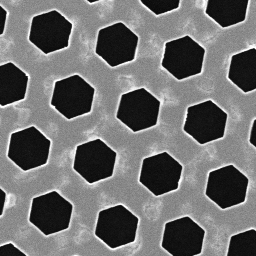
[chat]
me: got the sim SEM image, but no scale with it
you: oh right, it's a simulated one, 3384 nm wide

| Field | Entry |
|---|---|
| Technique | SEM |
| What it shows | a regular array of holes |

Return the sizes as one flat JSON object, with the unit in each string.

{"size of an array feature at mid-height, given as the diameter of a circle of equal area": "552 nm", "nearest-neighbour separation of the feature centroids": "0.89 µm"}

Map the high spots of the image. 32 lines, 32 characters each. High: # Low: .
##################....####.....#
.#####.############..#####.....#
.###....###################...##
.###.....####...################
####.....###.....###############
####....####.....####....#######
#####.######.....####.....####..
#############...####.....####...
..###################....####...
...######.############..#####...
...####....##################...
...####.....####...#############
...###......###.....############
#######....####.....####...#####
########..#####.....###.....####
################...####.....####
##...##################.....###.
#.....######.###########...####.
#.....####....##################
#.....###.....#####..###########
##....###.....####....##########
##########....####.....###....##
###########..####.....####.....#
##################....####.....#
.####...##################.....#
.###.....##################...##
####.....####...################
####.....###.....#####..########
#####...####.....####....#######
############.....###......###...
#############...####.....####...
...##################....###....